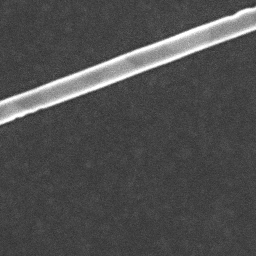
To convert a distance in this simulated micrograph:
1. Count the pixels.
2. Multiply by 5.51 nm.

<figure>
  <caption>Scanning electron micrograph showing one or a few lines or trenches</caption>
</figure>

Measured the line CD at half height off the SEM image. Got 118 nm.